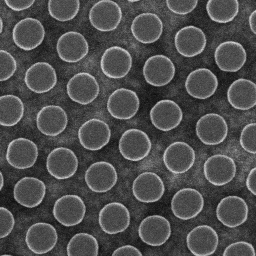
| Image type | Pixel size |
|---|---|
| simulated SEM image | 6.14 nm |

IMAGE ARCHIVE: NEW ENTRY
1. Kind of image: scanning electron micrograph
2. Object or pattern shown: a regular array of raised bodies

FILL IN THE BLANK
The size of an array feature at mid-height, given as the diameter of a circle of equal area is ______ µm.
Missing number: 0.189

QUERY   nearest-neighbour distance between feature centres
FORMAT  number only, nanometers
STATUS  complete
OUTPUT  258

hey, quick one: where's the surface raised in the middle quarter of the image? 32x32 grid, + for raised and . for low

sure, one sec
..........+++++++...+++++++.....
..........++++++....+++++++.....
....++.....+++++....+++++++....+
..++++++............+++++++....+
.+++++++.............+++++.....+
.++++++++......................+
.++++++++....+++...............+
.+++++++....++++++.............+
..++++++...+++++++..............
...+++.....++++++++.....+++.....
...........++++++++....++++++...
...........+++++++....+++++++...
............++++++....++++++++..
+.............++......+++++++...
+.....++++............+++++++...
.....++++++............+++++....
....+++++++......+.......+......
....+++++++....+++++............
....+++++++...+++++++...........
....+++++++...+++++++...........
.....+++++....++++++++....+++++.
+.............+++++++.....++++++
++.............++++++....+++++++
+++.............+++......+++++++
+++......................+++++++
+++....+++++..............++++++
+++...+++++++..............++++.
++...++++++++.......+++.........
+....++++++++.....++++++........
.....++++++++....+++++++........
......++++++.....++++++++.......
.......++++......++++++++....+++